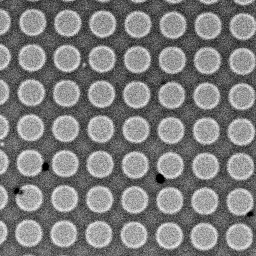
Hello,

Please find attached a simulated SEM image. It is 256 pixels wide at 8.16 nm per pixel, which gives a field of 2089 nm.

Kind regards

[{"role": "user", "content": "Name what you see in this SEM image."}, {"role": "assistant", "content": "an array of small figures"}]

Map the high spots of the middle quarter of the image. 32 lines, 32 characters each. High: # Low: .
###....#####....#####...######..
##......###......###.....####...
................................
................................
##..............................
###....#####....####.....####...
####..######...######...######..
####..######...######...######..
###...######...######...######..
###....#####....#####...#####...
.........#.......##......###....
................................
................................
##......###......#..............
###....#####....####....#####...
###...######...######...######..
####..######...######...######..
###...######...######...######..
##.....####.....####....#####...
..........................##....
................................
................................
##.....####.....###.......##....
###...######...#####....#####...
###...######...######...######..
###...######...######...######..
###...######...######...#####...
##.....####.....####....#####...
................................
................................
................................
##.....####.....###......###....